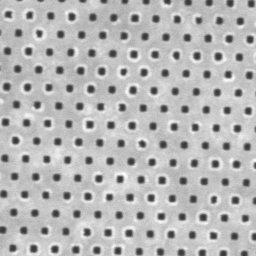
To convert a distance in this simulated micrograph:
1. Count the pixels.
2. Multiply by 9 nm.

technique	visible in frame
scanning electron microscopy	a regular array of holes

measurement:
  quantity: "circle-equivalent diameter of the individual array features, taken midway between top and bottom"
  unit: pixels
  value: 8.22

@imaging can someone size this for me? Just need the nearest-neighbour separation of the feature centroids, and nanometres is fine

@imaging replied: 183